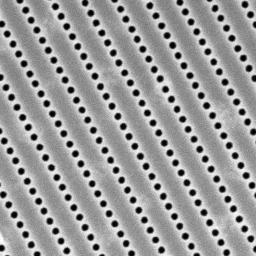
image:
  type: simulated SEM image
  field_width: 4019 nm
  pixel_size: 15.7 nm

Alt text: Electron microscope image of a regular array of holes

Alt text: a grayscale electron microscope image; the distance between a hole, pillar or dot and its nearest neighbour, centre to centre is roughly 178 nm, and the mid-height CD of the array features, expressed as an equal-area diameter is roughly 124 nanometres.